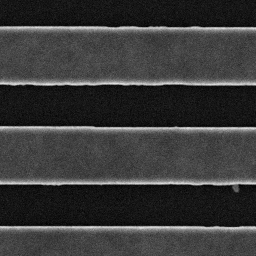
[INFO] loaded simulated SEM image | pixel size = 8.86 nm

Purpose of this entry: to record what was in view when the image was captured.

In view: lines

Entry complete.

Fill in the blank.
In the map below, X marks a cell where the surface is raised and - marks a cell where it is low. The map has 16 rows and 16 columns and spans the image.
----------------
----------------
XXXXXXXXXXXXXXXX
XXXXXXXXXXXXXXXX
XXXXXXXXXXXXXXXX
----------------
----------------
----------------
XXXXXXXXXXXXXXXX
XXXXXXXXXXXXXXXX
XXXXXXXXXXXXXXXX
--XX--------XX--
----------------
----------------
XXXXXXXXXXXXXXXX
XXXXXXXXXXXXXXXX